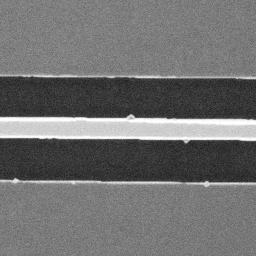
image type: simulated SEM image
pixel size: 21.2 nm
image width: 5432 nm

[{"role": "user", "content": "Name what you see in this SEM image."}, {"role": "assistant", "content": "lines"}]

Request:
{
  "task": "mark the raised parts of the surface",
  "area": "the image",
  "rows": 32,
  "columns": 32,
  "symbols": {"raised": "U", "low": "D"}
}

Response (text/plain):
UUUUUUUUUUUUUUUUUUUUUUUUUUUUUUUU
UUUUUUUUUUUUUUUUUUUUUUUUUUUUUUUU
UUUUUUUUUUUUUUUUUUUUUUUUUUUUUUUU
UUUUUUUUUUUUUUUUUUUUUUUUUUUUUUUU
UUUUUUUUUUUUUUUUUUUUUUUUUUUUUUUU
UUUUUUUUUUUUUUUUUUUUUUUUUUUUUUUU
UUUUUUUUUUUUUUUUUUUUUUUUUUUUUUUU
UUUUUUUUUUUUUUUUUUUUUUUUUUUUUUUU
UUUUUUUUUUUUUUUUUUUUUUUUUUUUUUUU
DDDUUUUUUUUUUUUUUUUUUUUUUUUUUUUU
DDDDDDDDDDDDDDDDDDDDDDDDDDDDDDDD
DDDDDDDDDDDDDDDDDDDDDDDDDDDDDDDD
DDDDDDDDDDDDDDDDDDDDDDDDDDDDDDDD
DDDDDDDDDDDDDDDDDDDDDDDDDDDDDDDD
DDDDDDDDDDDDDDDDDDDDDDDDDDDDDDDD
UUUUUUUUUUUUUUUUUUUUUUUUUUUUUUUU
UUUUUUUUUUUUUUUUUUUUUUUUUUUUUUUU
DDDDDDDDDDDDDDDDDDDDDDDUDDDDDDDD
DDDDDDDDDDDDDDDDDDDDDDDDDDDDDDDD
DDDDDDDDDDDDDDDDDDDDDDDDDDDDDDDD
DDDDDDDDDDDDDDDDDDDDDDDDDDDDDDDD
DDDDDDDDDDDDDDDDDDDDDDDDDDDDDDDD
DDDDDDDDDDDDDDDDDDDDDDDDDDDDDDDD
UUUUUUUUUUUUUUUUUUUUUUUUUUUUUUUU
UUUUUUUUUUUUUUUUUUUUUUUUUUUUUUUU
UUUUUUUUUUUUUUUUUUUUUUUUUUUUUUUU
UUUUUUUUUUUUUUUUUUUUUUUUUUUUUUUU
UUUUUUUUUUUUUUUUUUUUUUUUUUUUUUUU
UUUUUUUUUUUUUUUUUUUUUUUUUUUUUUUU
UUUUUUUUUUUUUUUUUUUUUUUUUUUUUUUU
UUUUUUUUUUUUUUUUUUUUUUUUUUUUUUUU
UUUUUUUUUUUUUUUUUUUUUUUUUUUUUUUU